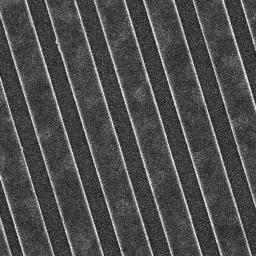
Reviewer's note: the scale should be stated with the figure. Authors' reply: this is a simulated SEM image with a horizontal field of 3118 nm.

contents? parallel lines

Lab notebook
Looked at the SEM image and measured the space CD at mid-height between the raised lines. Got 229 nm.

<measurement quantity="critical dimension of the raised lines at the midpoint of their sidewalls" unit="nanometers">350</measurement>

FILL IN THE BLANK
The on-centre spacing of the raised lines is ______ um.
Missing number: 0.574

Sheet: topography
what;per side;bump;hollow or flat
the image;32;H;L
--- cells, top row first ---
HHHLLLHHHHLLHHHHLLHHHHLLHHHHLLHH
HHHHLLHHHHLLHHHHLLHHHHLLLHHHLLLH
HHHHLLHHHHLLLHHHLLLHHHLLLHHHHLLH
LHHHLLLHHHLLLHHHHLLHHHHLLHHHHLLH
LHHHHLLHHHHLLHHHHLLHHHHLLLHHHLLH
LHHHHLLHHHHLLHHHHLLLHHHLLLHHHHLL
LHHHHLLLHHHLLLHHHHLLHHHHLLHHHHLL
LLHHHLLLHHHHLLHHHHLLHHHHLLHHHHLL
LLHHHHLLHHHHLLHHHHLLLHHHLLLHHHLL
LLHHHHLLHHHHLLLHHHLLLHHHHLLHHHHL
LLLHHHLLLHHHHLLHHHHLLHHHHLLHHHHL
HLLHHHHLLHHHHLLHHHHLLHHHHLLLHHHL
HLLHHHHLLHHHHLLLHHHLLLHHHLLLHHHH
HLLLHHHLLLHHHHLLHHHHLLHHHHLLHHHH
HLLLHHHHLLHHHHLLHHHHLLHHHHLLLHHH
HHLLHHHHLLHHHHLLHHHHLLLHHHLLLHHH
HHLLHHHHLLLHHHLLLHHHHLLHHHHLLHHH
HHLLLHHHHLLHHHHLLHHHHLLHHHHLLHHH
HHHLLHHHHLLHHHHLLHHHHLLLHHHLLLHH
HHHLLHHHHLLLHHHLLLHHHLLLHHHHLLHH
HHHLLLHHHLLLHHHHLLHHHHLLHHHHLLHH
HHHHLLHHHHLLHHHHLLHHHHLLHHHHLLLH
HHHHLLHHHHLLLHHHLLLHHHLLLHHHHLLH
HHHHLLLHHHLLLHHHHLLHHHHLLHHHHLLH
LHHHLLLHHHHLLHHHHLLHHHHLLHHHHLLL
LHHHHLLHHHHLLHHHHLLLHHHLLLHHHLLL
LHHHHLLLHHHLLLHHHLLLHHHHLLHHHHLL
LLHHHLLLHHHHLLHHHHLLHHHHLLHHHHLL
LLHHHHLLHHHHLLHHHHLLHHHHLLLHHHLL
HLHHHHLLHHHHLLLHHHLLLHHHLLLHHHHL
HLLHHHLLLHHHLLLHHHHLLHHHHLLHHHHL
HLLHHHHLLHHHHLLHHHHLLHHHHLLLHHHL